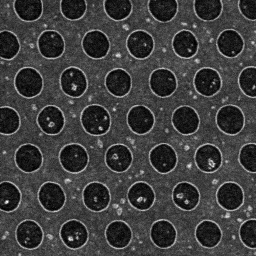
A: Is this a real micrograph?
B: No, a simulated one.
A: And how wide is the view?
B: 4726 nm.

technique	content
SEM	a regular array of raised bodies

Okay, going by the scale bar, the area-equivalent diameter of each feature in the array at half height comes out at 521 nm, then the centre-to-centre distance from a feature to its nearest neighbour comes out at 806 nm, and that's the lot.